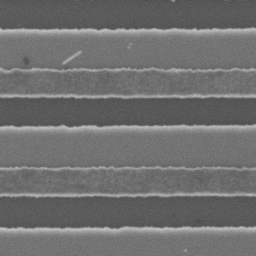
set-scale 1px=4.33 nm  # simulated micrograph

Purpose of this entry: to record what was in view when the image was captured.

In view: lines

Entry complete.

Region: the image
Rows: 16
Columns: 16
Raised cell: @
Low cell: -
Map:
----------------
----------------
@@@@@@@@@@@@@@@@
@@@@@@@@@@@@@@@@
@@@@@@@@@@@@@@@@
@@@@@@@@@@@@@@@@
----------------
----------------
@@@@@@@@@@@@@@@@
@@@@@@@@@@@@@@@@
@@@@@@@@@@@@@@@@
@@@@@@@@@@@@@@@@
----------------
----------------
@@@@@@@@@@@@@@@@
@@@@@@@@@@@@@@@@